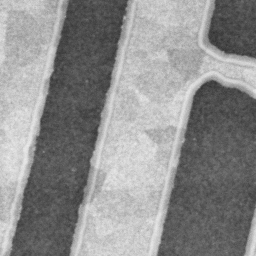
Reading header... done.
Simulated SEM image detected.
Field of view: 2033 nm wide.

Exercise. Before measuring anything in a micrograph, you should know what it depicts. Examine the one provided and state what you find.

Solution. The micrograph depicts one or a few lines or trenches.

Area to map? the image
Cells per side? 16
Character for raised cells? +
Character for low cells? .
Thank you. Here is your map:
++++....+++++...
++++....+++++...
+++.....+++++...
+++.....+++++...
+++....+++++++++
+++....+++++....
++.....+++++....
++.....++++.....
++.....++++.....
++....+++++.....
+.....+++++.....
+.....++++......
+.....++++......
+....+++++......
.....+++++......
.....++++.......